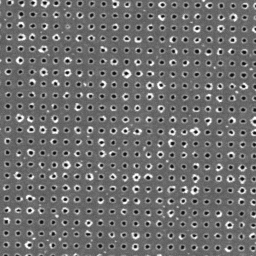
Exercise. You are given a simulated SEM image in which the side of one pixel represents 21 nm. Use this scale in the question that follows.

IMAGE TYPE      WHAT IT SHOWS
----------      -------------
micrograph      a regular array of holes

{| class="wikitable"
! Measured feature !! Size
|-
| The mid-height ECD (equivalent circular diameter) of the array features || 4.07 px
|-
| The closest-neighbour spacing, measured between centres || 238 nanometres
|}